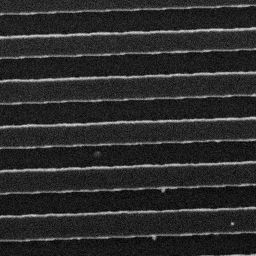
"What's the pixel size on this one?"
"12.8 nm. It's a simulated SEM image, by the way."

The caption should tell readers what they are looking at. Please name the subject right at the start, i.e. lines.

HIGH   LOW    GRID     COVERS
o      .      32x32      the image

oooooooooooooooooooooooooooooooo
ooooooo.........................
................................
................................
......oooooooooooooooooooooooooo
oooooooooooooooooooooooooooooooo
oooooooooooooooooooooooo........
................................
................................
..................oooooooooooooo
oooooooooooooooooooooooooooooooo
oooooooooooooooooooooooooooooooo
ooooooooooooo...................
................................
................................
...........ooooooooooooooooooooo
oooooooooooooooooooooooooooooooo
oooooooooooooooooooooooooooooooo
................................
................................
..........................oooooo
oooooooooooooooooooooooooooooooo
oooooooooooooooooooooooooooooooo
ooooooooooooooooooooooo.........
................................
................................
.................ooooooooooooooo
oooooooooooooooooooooooooooooooo
oooooooooooooooooooooooooooooooo
ooooooooooooooooo...............
................................
................................